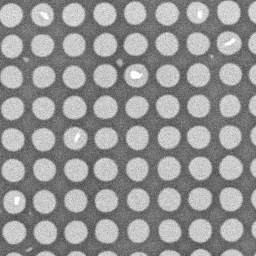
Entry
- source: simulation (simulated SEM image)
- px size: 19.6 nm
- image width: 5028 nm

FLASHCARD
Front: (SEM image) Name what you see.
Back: an array of small figures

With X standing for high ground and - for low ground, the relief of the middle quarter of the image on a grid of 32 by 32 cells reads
---------XXX-----XXX-----XX-----
-XXX----XXXXX---XXXXX---XXXX---X
XXXXX---XXXXX--XXXXXX--XXXXXX--X
XXXXX---XXXXX--XXXXXX--XXXXXX--X
XXXXX---XXXXX---XXXX----XXXX---X
-XXX-----XXX-----XX------XX-----
--------------------------------
--------------------------------
-XXX-----XXX-----XXX----XXXX----
XXXXX---XXXXX---XXXXX--XXXXXX--X
XXXXX---XXXXX---XXXXX--XXXXXX--X
XXXXXX--XXXXX---XXXXX--XXXXXX--X
XXXXX---XXXXX---XXXX----XXXX----
--XX-----XX---------------------
--------------------------------
--------------------------------
-XXXX----XXX----XXXXX---XXXX---X
XXXXX---XXXXX---XXXXX---XXXXX--X
XXXXXX--XXXXX---XXXXX---XXXXX--X
XXXXX---XXXXX---XXXXX---XXXXX--X
-XXXX----XXX----XXXX----XXXX----
--------------------------------
--------------------------------
-------------------------XX-----
-XXXX---XXXX----XXXX----XXXXX---
XXXXXX--XXXXX---XXXXX---XXXXX--X
XXXXXX--XXXXX---XXXXX---XXXXX--X
XXXXXX--XXXXX---XXXXX---XXXXX---
-XXXX----XXX-----XXX----XXXX----
--------------------------------
--------------------------------
---X-------------XXX-----XXX----